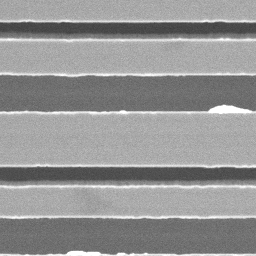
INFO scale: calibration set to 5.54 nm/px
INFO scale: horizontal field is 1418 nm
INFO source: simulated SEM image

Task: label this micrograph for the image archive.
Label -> lines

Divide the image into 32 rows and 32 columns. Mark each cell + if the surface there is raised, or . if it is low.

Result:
++++++++++++++++++++++++++++++++
++++++++++++++++++++++++++++++++
++++++++++++++++++++++++++++++++
................................
................................
++++++++++++++++++++++++++++++++
++++++++++++++++++++++++++++++++
++++++++++++++++++++++++++++++++
++++++++++++++++++++++++++++++++
................................
................................
................................
................................
...........................+++..
++++++++++++++++++++++++++++++++
++++++++++++++++++++++++++++++++
++++++++++++++++++++++++++++++++
++++++++++++++++++++++++++++++++
++++++++++++++++++++++++++++++++
++++++++++++++++++++++++++++++++
++++++++++++++++++++++++++++++++
................................
................................
++++++++++++++++++++++++++++++++
++++++++++++++++++++++++++++++++
++++++++++++++++++++++++++++++++
++++++++++++++++++++++++++++++++
................................
................................
................................
................................
.........++.....................